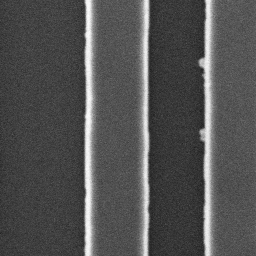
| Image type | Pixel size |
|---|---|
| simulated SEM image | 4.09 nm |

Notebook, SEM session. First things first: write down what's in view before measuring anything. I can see lines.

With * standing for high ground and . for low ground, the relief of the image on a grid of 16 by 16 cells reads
.....****....***
.....****....***
.....****....***
.....****....***
.....****....***
.....****....***
.....****....***
.....****....***
.....****....***
.....****....***
.....****....***
.....****....***
.....****....***
.....****....***
.....****....***
.....****....***